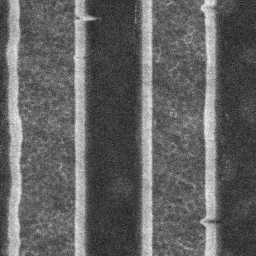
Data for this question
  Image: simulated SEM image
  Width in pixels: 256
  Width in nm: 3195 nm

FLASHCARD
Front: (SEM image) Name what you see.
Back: one or a few lines or trenches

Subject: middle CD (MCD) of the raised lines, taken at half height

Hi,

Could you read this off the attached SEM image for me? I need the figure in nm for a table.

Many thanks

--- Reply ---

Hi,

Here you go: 812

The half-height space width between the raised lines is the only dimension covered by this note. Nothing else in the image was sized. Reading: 0.823 micrometres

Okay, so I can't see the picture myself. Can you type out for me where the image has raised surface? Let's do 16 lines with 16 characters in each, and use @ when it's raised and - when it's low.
-@@@@----@@@@---
-@@@@----@@@@---
-@@@@----@@@@---
-@@@@----@@@@---
-@@@@----@@@@---
-@@@@----@@@@---
-@@@@----@@@@---
-@@@@----@@@@---
-@@@@----@@@@---
-@@@@----@@@@---
-@@@@----@@@@---
-@@@@----@@@@---
-@@@@----@@@@---
-@@@@----@@@@---
-@@@@----@@@@---
-@@@@----@@@@---